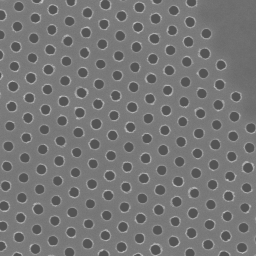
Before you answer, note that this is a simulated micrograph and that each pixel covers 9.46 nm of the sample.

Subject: a regular array of holes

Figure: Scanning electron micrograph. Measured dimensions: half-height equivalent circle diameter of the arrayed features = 88.6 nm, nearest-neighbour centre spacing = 185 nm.